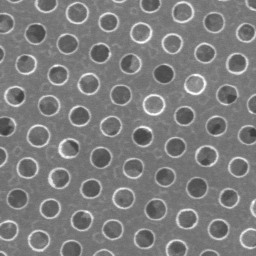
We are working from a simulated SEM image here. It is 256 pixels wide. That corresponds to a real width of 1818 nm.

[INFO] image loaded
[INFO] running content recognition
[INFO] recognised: a regular array of raised bodies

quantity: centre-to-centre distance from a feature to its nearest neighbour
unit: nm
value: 229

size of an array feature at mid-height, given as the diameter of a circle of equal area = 148 nanometers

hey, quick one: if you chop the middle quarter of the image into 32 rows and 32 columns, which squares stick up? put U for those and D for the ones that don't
DDDDDDDDDDDDDDUUUUUDDDDUUUDDDDDD
UDDDDDDDDDDDDDUUUUUDDDUUUUUDDDDD
UDDDDDUDDDDDDDDDDDDDDDUUUUUUDDDD
UDDDUUUUDDDDDDDDDDDDDDDUUUUDDDDU
DDDDUUUUUDDDDDDDDDDDDDDDUUUDDDUU
DDDDUUUUUDDDDUUDDDDDDDDDDDDDDDUU
DDDDUUUUDDDDUUUUDDDDDDDDDDDDDDDU
DDDDDUUDDDDDUUUUUDDDDDDDDDDDDDDD
DDDDDDDDDDDDUUUUUDDDUUUUDDDDDDDD
DDDDDDDDDDDDUUUUDDDDUUUUUDDDDDDD
DDDDDDDDDDDDDDDDDDDDUUUUUDDDDDDD
DDUUUUDDDDDDDDDDDDDDUUUUUDDDUUUU
DUUUUUDDDDDDDDDDDDDDDUUDDDDDUUUU
DUUUUUUDDDUUUDDDDDDDDDDDDDDDUUUU
DDUUUUDDDUUUUUDDDDDDDDDDDDDDUUUU
DDDDDDDDDUUUUUDDDDDDDDDDDDDDDDDD
DDDDDDDDDUUUUUDDDDUUUUDDDDDDDDDD
DDDDDDDDDDUUUDDDDUUUUUDDDDDDDDDD
DDDDDDDDDDDDDDDDDUUUUUDDDDDUUDDD
UUUDDDDDDDDDDDDDDDUUUUDDDDUUUUDD
UUUUDDDDDDDDDDDDDDDUUDDDDUUUUUDD
UUUUDDDUUUUDDDDDDDDDDDDDDUUUUUDD
UUUDDDDUUUUUDDDDDDDDDDDDDDUUUUDD
DDDDDDDUUUUUDDDDDDDDDDDDDDDDDDDD
DDDDDDDUUUUUDDDUUUUDDDDDDDDDDDDD
DDDDDDDDUUUDDDDUUUUUDDDDDDDDDDDD
DDDDDDDDDDDDDDDUUUUUDDDDUUUDDDDD
UDDDDDDDDDDDDDDUUUUDDDDUUUUUDDDD
UDDDDDDDDDDDDDDDDDDDDDDUUUUUDDDD
UDDDDUUUUDDDDDDDDDDDDDDUUUUDDDDU
UDDDUUUUUDDDDDDDDDDDDDDDDUDDDDDU
DDDDUUUUUDDDDUUUDDDDDDDDDDDDDDDU